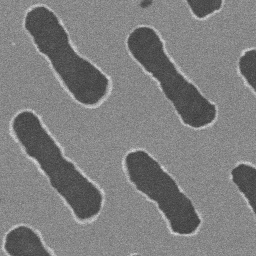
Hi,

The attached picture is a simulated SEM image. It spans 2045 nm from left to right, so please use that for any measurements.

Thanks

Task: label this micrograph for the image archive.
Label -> holes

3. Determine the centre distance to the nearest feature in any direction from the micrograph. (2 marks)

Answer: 855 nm